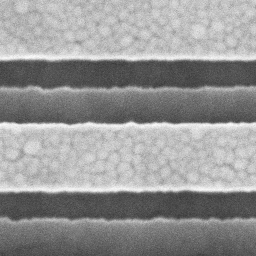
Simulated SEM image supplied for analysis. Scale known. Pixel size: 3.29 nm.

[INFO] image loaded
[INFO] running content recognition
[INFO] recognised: lines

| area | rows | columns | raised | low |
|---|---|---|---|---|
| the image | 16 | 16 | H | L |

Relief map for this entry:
HHHHHHHHHHHHHHHH
HHHHHHHHHHHHHHHH
HHHHHHHHHHHHHHHH
HHHHHHHHHHHHHHHH
LLLLLLLLLLLLLLLL
LLLLLLLLLLLLLLLL
LLLLLLLLLLLLLLLL
LLLLLLLLLLLLLLLL
HHHHHHHHHHHHHHHH
HHHHHHHHHHHHHHHH
HHHHHHHHHHHHHHHH
HHHHHHHHHHHHHHHH
LLLLLLLLLLLLLLLL
LLLLLLLLLLLLLLLL
LLLLLLLLLLLLLLLL
LLLLLLLLLLLLLLLL